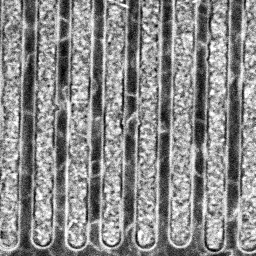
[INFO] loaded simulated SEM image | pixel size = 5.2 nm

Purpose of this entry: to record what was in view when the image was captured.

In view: parallel lines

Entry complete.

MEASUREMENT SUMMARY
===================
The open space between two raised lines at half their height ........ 107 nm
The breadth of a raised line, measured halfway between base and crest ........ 0.0682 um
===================